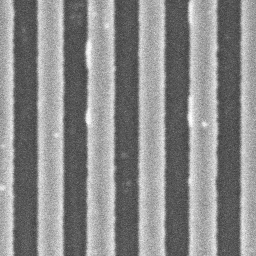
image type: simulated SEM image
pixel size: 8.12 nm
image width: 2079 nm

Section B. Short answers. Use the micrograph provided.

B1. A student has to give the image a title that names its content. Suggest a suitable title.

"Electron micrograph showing lines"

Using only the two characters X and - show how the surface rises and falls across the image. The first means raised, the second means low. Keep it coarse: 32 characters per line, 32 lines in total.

X----XXX---XXX----XX----XXX---XX
XX---XXX---XXX----XX----XXX---XX
XX---XXX---XXX---XXX----XXX---XX
XX---XXX---XXX----XX----XXX---XX
XX---XXX---XXX----XX----XXX---XX
X----XXX---XXX----XX----XXX---XX
X----XXX---XXX---XXX----XXX---XX
XX---XXX---XXX----XX----XXX---XX
XX---XXX---XXX----XX----XXX---XX
XX---XXX---XXX----XX----XXX---XX
XX---XXX---XXX----XX----XXX---XX
X----XXX---XXX----XX----XXX---XX
XX---XXX---XXX----XX----XXX---XX
XX---XXX---XXX----XX----XXX---XX
XX---XXX---XXX----XX----XXX---XX
XX---XXX---XXX----XX----XXX---XX
XX---XXX---XXX----XX----XXX---XX
XX---XXX---XXX---XXX----XXX---XX
X----XXX---XXX----XX----XXX---XX
XX---XXX---XXX----XX----XXX---XX
X----XXX---XXX---XXX----XXX---XX
X----XXX---XXX----XX----XXX---XX
X----XXX---XXX---XXX----XXX---XX
X----XXX---XXX----XX----XXX---XX
XX---XXX---XXX----XX----XXX---XX
X----XXX---XXX----XX----XXX---XX
XX---XXX---XXX----XX----XXX---XX
XX---XXX---XXX----XX----XXX---XX
X----XXX---XXX---XXX----XXX---XX
XX---XXX---XXX---XXX----XXX---XX
X----XXX---XXX----XX----XXX---XX
X----XXX---XXX----XX----XXX---XX